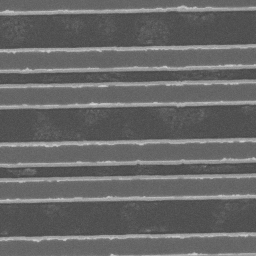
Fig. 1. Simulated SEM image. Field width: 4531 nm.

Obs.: parallel lines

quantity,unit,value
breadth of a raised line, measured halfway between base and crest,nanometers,372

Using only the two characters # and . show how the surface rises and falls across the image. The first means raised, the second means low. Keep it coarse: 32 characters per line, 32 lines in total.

################################
##########......................
................................
................................
................................
................................
################################
################################
#######################.........
................................
................################
################################
################################
................................
................................
................................
................................
.............................###
################################
################################
##########......................
................................
...#############################
################################
################################
................................
................................
................................
................................
................###.############
################################
################################